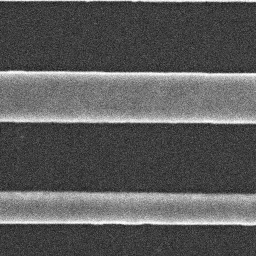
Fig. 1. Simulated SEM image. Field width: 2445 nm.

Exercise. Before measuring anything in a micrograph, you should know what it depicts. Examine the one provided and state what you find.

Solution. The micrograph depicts lines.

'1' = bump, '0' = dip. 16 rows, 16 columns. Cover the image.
0000000000000000
0000000000000000
0000000000000000
0000000000000000
0000000000000000
1111111111111111
1111111111111111
1111111111111111
0000000000000000
0000000000000000
0000000000000000
0000000000000000
1111111111111111
1111111111111111
0000000000000000
0000000000000000